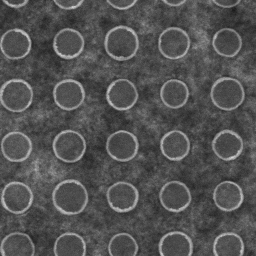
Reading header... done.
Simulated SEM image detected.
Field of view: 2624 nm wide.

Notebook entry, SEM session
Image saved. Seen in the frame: a regular array of raised bodies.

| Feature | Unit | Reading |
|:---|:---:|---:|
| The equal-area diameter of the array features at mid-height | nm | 307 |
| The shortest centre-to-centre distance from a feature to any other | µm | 0.523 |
